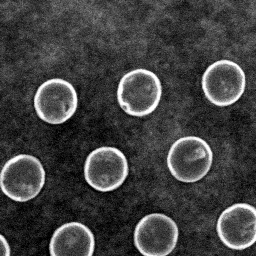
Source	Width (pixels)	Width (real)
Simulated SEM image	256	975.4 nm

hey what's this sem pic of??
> raised bodies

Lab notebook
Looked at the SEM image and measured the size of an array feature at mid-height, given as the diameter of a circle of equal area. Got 167 nm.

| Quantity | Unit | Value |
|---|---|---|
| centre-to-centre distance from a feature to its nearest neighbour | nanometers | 319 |